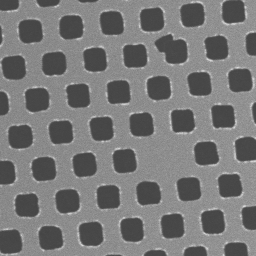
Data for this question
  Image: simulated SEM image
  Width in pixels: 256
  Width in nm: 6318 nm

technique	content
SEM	a regular array of holes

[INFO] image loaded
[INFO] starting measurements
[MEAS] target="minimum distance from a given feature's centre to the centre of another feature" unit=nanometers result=982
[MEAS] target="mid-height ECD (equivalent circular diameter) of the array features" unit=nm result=634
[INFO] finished